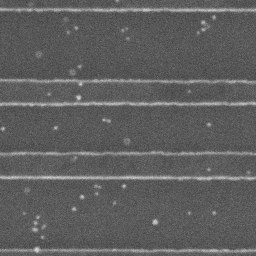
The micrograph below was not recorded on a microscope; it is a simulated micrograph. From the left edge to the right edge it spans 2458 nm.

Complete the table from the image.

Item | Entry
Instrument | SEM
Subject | lines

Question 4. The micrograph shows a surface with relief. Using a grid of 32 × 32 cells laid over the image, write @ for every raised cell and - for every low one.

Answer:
@@@@@@@@@@@@@@@@@@@@@@@@@@@@@@@@
--------------------------------
--------------------------------
--------------------------------
--------------------------------
--------------------------------
--------------------------------
--------------------------------
--------------------------------
--------------------------------
@@@@@@@@@@@@@@@@@@@@@@@@@@@@@@@@
@@@@@@@@@@@@@@@@@@@@@@@@@@@@@@@@
@@@@@@@@@@@@@@@@@@@@@@@@@@@@@@@@
--------------------------------
--------------------------------
--------------------------------
--------------------------------
--------------------------------
--------------------------------
@@@@@@@@@@@@@@@@@@@@@@@@@@@@@@@@
@@@@@@@@@@@@@@@@@@@@@@@@@@@@@@@@
@@@@@@@@@@@@@@@@@@@@@@@@@@@@@@@@
--------------------------------
--------------------------------
--------------------------------
--------------------------------
--------------------------------
--------------------------------
--------------------------------
--------------------------------
--------------------------------
@@@@@@@@@@@@@@@@@@@@@@@@@@@@@@@@